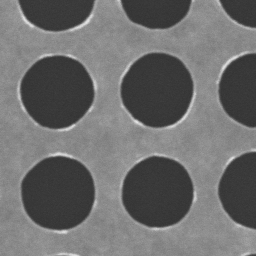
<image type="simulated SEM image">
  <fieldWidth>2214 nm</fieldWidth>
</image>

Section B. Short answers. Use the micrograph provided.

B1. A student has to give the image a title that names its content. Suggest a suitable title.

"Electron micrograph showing holes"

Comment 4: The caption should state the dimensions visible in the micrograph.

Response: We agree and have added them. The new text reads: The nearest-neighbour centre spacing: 865 nanometres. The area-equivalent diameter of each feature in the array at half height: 639 nm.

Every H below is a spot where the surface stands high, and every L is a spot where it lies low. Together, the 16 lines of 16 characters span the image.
HLLLLLHHLLLLHHLL
HHLLLHHHHLLHHHHL
HHHHHHHHHHHHHHHH
HHHLHHHHHLLHHHHL
HHLLLLHHLLLLHHLL
HLLLLLHHLLLLHHLL
HLLLLLHHLLLLHHLL
HHLLLHHHHLLHHHHL
HHHHHHHHHHHHHHHH
HHHHHHHHHHHHHHHH
HHLLLHHHLLLLHHLL
HLLLLLHHLLLLHHLL
HLLLLLHHLLLLHHLL
HHLLLHHHLLLLHHLL
HHHHHHHHHHHHHHHH
HHHHHHHHHHHHHHHH